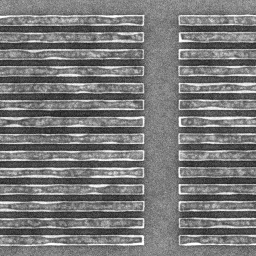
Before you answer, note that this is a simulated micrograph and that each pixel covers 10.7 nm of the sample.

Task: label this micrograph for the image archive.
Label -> groups of lines, slits or small figures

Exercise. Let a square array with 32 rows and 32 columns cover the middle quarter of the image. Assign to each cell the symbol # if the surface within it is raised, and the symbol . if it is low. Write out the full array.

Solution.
................................
####################.........###
####################.........###
................................
................................
####################.........###
####################.........###
................................
................................
####################.........###
####################.........###
................................
................................
....##########.....#.........###
####################.........###
##...###############.........###
................................
................................
####################.........###
####################.........###
................................
................................
####################.........###
####################.........###
................................
................................
####################.........###
####################.........###
................................
................................
#######...##########.........###
####################.........###